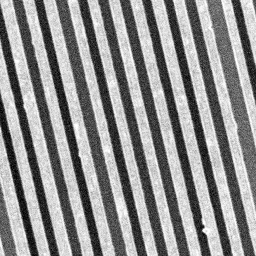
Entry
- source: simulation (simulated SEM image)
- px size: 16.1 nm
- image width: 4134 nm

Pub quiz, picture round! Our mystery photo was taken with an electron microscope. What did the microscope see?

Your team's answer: parallel lines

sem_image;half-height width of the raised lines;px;10.2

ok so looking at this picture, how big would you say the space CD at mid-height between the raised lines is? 11.1 px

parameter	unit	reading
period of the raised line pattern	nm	341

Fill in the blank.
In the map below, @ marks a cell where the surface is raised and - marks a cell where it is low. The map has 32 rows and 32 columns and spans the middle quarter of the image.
@----@@---@@---@@@---@@---@@@--@
@@---@@---@@---@@@---@@---@@@--@
@@---@@@--@@@---@@---@@@--@@@---
@@----@@---@@---@@---@@@---@@---
@@----@@---@@---@@----@@---@@@--
@@@---@@---@@---@@@---@@---@@@--
@@@---@@@--@@@---@@---@@@--@@@--
-@@----@@---@@---@@---@@@---@@--
-@@----@@---@@---@@----@@---@@@-
-@@@---@@---@@---@@@---@@---@@@-
-@@@---@@@--@@----@@---@@@--@@@-
--@@---@@@---@@---@@---@@@---@@-
--@@----@@---@@---@@---@@@---@@@
--@@@---@@---@@---@@@---@@---@@@
--@@@---@@@--@@@--@@@---@@@--@@@
--@@@---@@@--@@@---@@---@@@--@@@
---@@----@@---@@---@@---@@@---@@
---@@----@@---@@---@@@---@@---@@
---@@@---@@---@@---@@@---@@---@@
@--@@@---@@@--@@@---@@---@@@--@@
@---@@----@@---@@---@@---@@@---@
@---@@----@@---@@---@@----@@---@
@---@@@---@@---@@---@@@---@@---@
@@--@@@---@@@--@@@---@@---@@@--@
@@---@@----@@---@@---@@---@@@---
@@---@@----@@---@@---@@----@@---
@@---@@@---@@---@@---@@@---@@---
@@@--@@@---@@@--@@@---@@---@@@--
@@@--@@@---@@@--@@@---@@---@@@--
@@@---@@----@@---@@---@@---@@@--
-@@---@@@---@@---@@---@@@---@@--
-@@---@@@---@@---@@@--@@@---@@@-